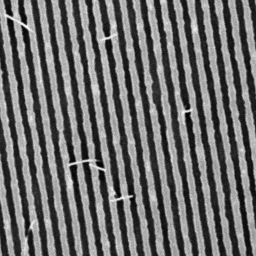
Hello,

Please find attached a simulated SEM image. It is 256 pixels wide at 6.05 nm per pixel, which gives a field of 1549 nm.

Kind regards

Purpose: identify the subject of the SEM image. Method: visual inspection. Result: parallel lines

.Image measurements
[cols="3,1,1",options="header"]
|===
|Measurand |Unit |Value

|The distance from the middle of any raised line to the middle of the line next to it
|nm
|81.4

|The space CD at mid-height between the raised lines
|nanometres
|41.2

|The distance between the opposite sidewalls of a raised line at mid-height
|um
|0.0404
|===